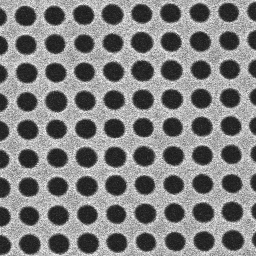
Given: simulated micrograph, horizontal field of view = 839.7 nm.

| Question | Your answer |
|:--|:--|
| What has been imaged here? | a regular array of holes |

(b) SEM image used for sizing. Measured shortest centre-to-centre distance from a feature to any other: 93.3 nanometres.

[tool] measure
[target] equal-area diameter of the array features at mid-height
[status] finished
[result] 65.7 nanometres